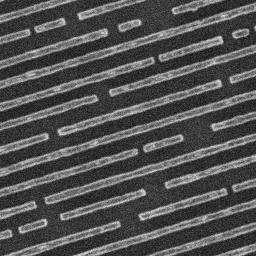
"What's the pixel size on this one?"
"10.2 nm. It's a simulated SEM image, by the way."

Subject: parallel lines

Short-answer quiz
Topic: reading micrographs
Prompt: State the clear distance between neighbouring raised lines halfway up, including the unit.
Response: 145 nanometers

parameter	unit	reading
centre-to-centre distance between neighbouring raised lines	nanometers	213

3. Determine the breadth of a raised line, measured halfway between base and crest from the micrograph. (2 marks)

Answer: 0.0634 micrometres